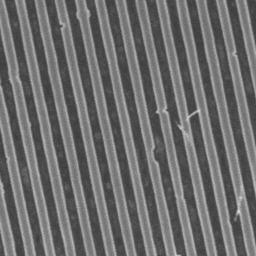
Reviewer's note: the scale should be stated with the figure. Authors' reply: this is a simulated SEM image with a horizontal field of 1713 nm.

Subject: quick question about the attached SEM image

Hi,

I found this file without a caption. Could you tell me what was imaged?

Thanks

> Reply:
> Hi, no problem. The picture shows parallel lines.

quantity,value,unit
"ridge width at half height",60.6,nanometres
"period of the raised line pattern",0.132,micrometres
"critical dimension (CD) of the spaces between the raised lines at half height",73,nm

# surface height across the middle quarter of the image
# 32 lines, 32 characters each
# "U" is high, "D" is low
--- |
DUUDDDUUDDDUUDDDUUUDDUUUDDUUUDDU
DDUDDDUUUDDUUUDDUUUDDDUUDDDUUDDD
DDUUDDDUUDDDUUDDDUUDDDUUDDDUUDDD
DDUUDDDUUDDDUUDDDUUDDDUUDDDUUDDD
DDUUDDDUUDDDUUDDDUUDDDUUDDDUUDDD
DDUUDDDUUDDDUUDDDUUUDDUUUDDUUUDD
DDDUUDDUUUDDUUUDDDUUDDUUUDDDUUDD
DDDUUDDDUUDDDUUDDDUUDDDUUDDDUUDD
DDDUUDDDUUDDDUUDDDUUDDDUUDDDUUDD
DDDUUDDDUUDDDUUDDDUUDDDUUDDDUUDD
DDDUUUDDUUDDDUUDDDUUDDDUUDDDUUUD
UDDDUUDDUUUDDUUUDDDUUDDUUDDDDUUD
UDDDUUDDDUUDDDUUDDDUUDDDUUDDDUUD
UDDDUUDDDUUDDDUUDDDUUDDDUUDDDUUD
UDDDUUDDDUUDDDUUDDDUUDDDUUDDDUUD
UDDDUUUDDUUDDDUUDDDUUUDDUUDDDUUD
UUDDDUUDDUUUDDUUUDDUUUDDDUUDDUUU
UUDDDUUDDDUUDDDUUDDDUUDDDUUDDDUU
UUDDDUUDUDUUDDDUUDDDUUDDDUUDDDUU
UUDDDUUDDDUUDDDUUDDDUUDUDUUDDDUU
UUDDDUUDDDUUUDDUUUDDUUUDDUUDDDUU
UUUDDDUUDDUUUDDUUUDDDUDDDDUUDDDU
DUUDDDUUDDDUUDDDUUDDDUDDDDUUDDDU
DUUDDDUUDDDUUDDDUUDDDUUDDDUUDDDU
DUUDDDUUDDDUUDDDUUDDDUUDDDUUDDDU
DUUDDDUUUDDUUUDDDUUDDUUUDDUUDDDU
DUUUDDDUUDDUUUDDDUUDDDUUDDDUUDDD
DDUUDDDUUDDDUUDDDUUDDDUUDDDUUDDD
DDUUDDDUUDDDUUDDDUUDDDUUDDDUUDDD
DDUUDDDUUDDDUUDDDUUDDDUUDDDUUDDD
DDUUDDDUUDDDUUUDDDUUDDUUDDDUUDDD
DDUUUDDUUUDDUUUDDDUUDDDUUDDDUDDD